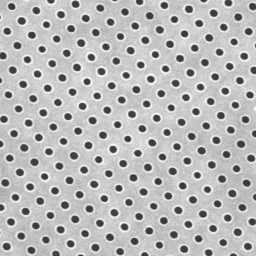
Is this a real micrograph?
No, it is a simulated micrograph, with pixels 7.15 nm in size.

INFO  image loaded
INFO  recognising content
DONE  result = a regular array of holes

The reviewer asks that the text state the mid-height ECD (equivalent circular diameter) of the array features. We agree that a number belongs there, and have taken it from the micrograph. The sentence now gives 8.06 pixels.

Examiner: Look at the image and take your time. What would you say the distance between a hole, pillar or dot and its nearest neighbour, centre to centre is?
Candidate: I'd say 124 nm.